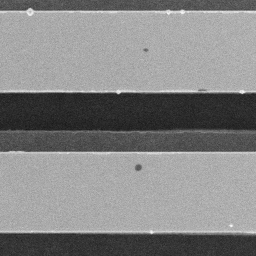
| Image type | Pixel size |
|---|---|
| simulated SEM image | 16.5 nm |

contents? lines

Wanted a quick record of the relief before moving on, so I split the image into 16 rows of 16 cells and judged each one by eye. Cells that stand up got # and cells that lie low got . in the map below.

################
################
################
################
################
################
................
................
################
################
################
################
################
################
.........#.....#
................